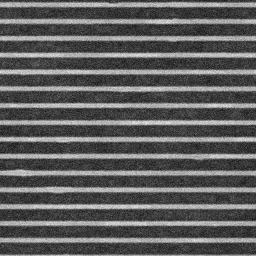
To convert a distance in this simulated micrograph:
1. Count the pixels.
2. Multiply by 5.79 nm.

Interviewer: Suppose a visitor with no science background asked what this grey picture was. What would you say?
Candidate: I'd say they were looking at parallel lines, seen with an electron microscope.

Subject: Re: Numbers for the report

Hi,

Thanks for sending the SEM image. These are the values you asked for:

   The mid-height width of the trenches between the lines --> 75.9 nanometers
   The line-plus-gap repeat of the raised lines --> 16.8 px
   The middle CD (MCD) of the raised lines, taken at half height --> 0.0253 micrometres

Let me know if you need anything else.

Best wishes